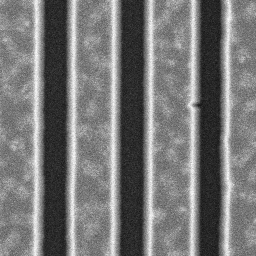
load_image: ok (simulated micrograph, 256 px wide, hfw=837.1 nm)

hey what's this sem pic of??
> one or a few lines or trenches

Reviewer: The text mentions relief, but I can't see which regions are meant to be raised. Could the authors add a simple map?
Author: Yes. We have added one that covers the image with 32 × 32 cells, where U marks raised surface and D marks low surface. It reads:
UUUUUDDDDUUUUUUDDDUUUUUUUDDDUUUU
UUUUUDDDDUUUUUUDDDUUUUUUUDDDUUUU
UUUUUDDDDUUUUUUDDDUUUUUUUDDDUUUU
UUUUUDDDDUUUUUUDDDUUUUUUUDDDUUUU
UUUUUDDDDUUUUUUDDDUUUUUUUDDDUUUU
UUUUUDDDDUUUUUUDDDUUUUUUUDDDUUUU
UUUUUDDDDUUUUUUDDDUUUUUUUDDDUUUU
UUUUUDDDDUUUUUUDDDUUUUUUUDDDUUUU
UUUUUDDDDUUUUUUDDDUUUUUUUDDDUUUU
UUUUUDDDDUUUUUUDDDUUUUUUUDDDUUUU
UUUUUDDDDUUUUUUDDDUUUUUUUDDDUUUU
UUUUUDDDDUUUUUUDDDUUUUUUUDDDUUUU
UUUUUDDDDUUUUUUDDDUUUUUUUDDDUUUU
UUUUUDDDDUUUUUUDDDUUUUUUDDDDUUUU
UUUUUDDDDUUUUUUDDDUUUUUUUDDDUUUU
UUUUUDDDDUUUUUUDDDUUUUUUUDDDUUUU
UUUUUDDDDUUUUUUDDDUUUUUUUDDDUUUU
UUUUUDDDDUUUUUUDDDUUUUUUUDDDUUUU
UUUUUDDDDUUUUUUDDDUUUUUUDDDDUUUU
UUUUUDDDDUUUUUUDDDUUUUUUDDDDUUUU
UUUUUDDDDUUUUUUDDDUUUUUUDDDDUUUU
UUUUUDDDDUUUUUUDDDUUUUUUDDDDUUUU
UUUUUDDDDUUUUUUDDDUUUUUUDDDDUUUU
UUUUUDDDDUUUUUUDDDUUUUUUDDDDUUUU
UUUUUDDDDUUUUUUDDDUUUUUUDDDDUUUU
UUUUUDDDDUUUUUUDDDUUUUUUDDDDUUUU
UUUUUDDDDUUUUUUDDDUUUUUUDDDDUUUU
UUUUUDDDDUUUUUUDDDUUUUUUDDDDUUUU
UUUUUDDDDUUUUUUDDDUUUUUUDDDDUUUU
UUUUUDDDDUUUUUUDDDUUUUUUDDDDUUUU
UUUUUDDDDUUUUUUDDDUUUUUUDDDDUUUU
UUUUUDDDDUUUUUUDDDUUUUUUDDDDUUUU